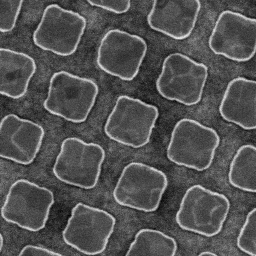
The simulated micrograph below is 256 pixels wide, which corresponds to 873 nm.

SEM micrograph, a regular array of raised bodies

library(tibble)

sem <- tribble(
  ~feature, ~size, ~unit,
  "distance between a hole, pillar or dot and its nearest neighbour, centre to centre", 65.7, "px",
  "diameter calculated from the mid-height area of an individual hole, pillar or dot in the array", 164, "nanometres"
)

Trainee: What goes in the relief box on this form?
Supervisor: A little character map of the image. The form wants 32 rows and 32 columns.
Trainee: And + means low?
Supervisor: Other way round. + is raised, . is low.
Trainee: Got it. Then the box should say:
+++........+++++...++++++.......
++....+++..........++++++...+...
++...+++++.........+++++...+++++
++...++++++........+++++...+++++
....++++++...++++....++...++++++
.....+++++...+++++........++++++
++.....++...++++++.........+++++
++++........++++++...+++........
++++.........++++...++++++......
++++...++......++...++++++......
+++...++++++........++++++...+++
+++...++++++........+++++...++++
......++++++...++.....+++...++++
......+++++...+++++.........++++
.+......+++...++++++........++++
++++.........++++++...+++.....++
+++++........++++++...+++++.....
+++++...++....++++...++++++.....
+++++...+++++........++++++...++
++++...++++++........++++++...++
.......++++++...+......+++...+++
.......+++++...+++++.........+++
........++++...++++++........+++
.++++.........+++++++...+.....++
.++++++.......++++++...+++++....
.+++++.........+++++...++++++...
++++++...++++.........++++++...+
.+++++...+++++........++++++...+
...++...++++++.........+++++..++
........++++++...++++.........++
.........++++....+++++........++
...+++....++....++++++.........+